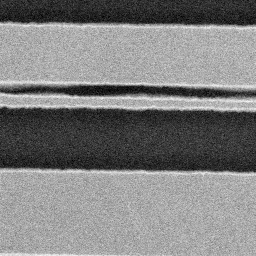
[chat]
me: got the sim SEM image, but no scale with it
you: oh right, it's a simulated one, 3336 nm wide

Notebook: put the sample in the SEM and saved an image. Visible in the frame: lines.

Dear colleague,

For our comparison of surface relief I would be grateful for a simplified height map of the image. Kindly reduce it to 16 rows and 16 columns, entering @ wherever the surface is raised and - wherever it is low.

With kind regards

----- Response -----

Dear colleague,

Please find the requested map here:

----------------
@---------------
@@@@@@@@@@@@@@@@
@@@@@@@@@@@@@@@@
@@@@@@@@@@@@@@@@
@@@@@@@@@@@@@@@@
@@@@@@@@@@@@@@@@
----------------
----------------
----------------
----------------
@@@@@@@@@@@@@@@@
@@@@@@@@@@@@@@@@
@@@@@@@@@@@@@@@@
@@@@@@@@@@@@@@@@
@@@@@@@@@@@@@@@@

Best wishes